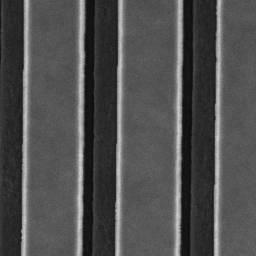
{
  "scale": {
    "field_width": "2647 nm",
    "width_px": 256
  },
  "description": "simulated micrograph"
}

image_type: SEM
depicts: lines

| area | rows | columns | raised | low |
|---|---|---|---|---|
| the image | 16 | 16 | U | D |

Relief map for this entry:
DDUUUDDUUUUDDDUU
DDUUUDDUUUUDDDUU
DDUUUDDUUUUDDDUU
DDUUUDDUUUUDDDUU
DDUUUDDUUUUDDDUU
DDUUUDDUUUUDDDUU
DUUUUDDUUUUDDDUU
DUUUUDDUUUUDDDUU
DUUUUDDUUUUDDUUU
DUUUUDDUUUUDDUUU
DUUUUDDUUUUDDUUU
DUUUUDDUUUUDDUUU
DUUUUDDUUUUDDUUU
DUUUUDDUUUUDDUUU
DUUUUDDUUUUDDUUU
DUUUUDDUUUUDDUUU